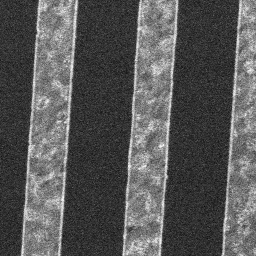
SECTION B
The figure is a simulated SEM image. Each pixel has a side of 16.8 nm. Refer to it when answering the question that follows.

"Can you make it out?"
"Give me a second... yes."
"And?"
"one or a few lines or trenches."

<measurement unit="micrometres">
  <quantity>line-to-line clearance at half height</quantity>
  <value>1.06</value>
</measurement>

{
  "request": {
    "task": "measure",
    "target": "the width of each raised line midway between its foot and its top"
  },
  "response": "619 nm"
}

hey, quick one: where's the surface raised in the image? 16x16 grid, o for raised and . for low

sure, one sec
..ooo....oo....o
..ooo....oo....o
..ooo....oo....o
..ooo....oo....o
..oo....ooo....o
..oo....ooo....o
..oo....ooo....o
..oo....ooo....o
..oo....ooo...oo
..oo....oo....oo
..oo....oo....oo
..oo....oo....oo
..oo....oo....oo
..oo....oo....oo
.ooo....oo....oo
.ooo....oo....oo